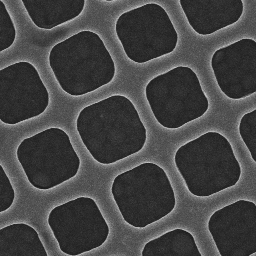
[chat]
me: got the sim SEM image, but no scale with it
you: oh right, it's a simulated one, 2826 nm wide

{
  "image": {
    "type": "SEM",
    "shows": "holes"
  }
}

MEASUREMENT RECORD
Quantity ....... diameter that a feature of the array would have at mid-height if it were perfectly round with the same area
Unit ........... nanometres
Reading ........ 678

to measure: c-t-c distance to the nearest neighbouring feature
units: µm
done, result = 0.784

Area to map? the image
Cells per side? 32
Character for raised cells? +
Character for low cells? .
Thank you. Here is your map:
+++........+++++++.++++.......++
.++.......++++++.....++.......++
.+++.....++++++......++.......++
..+++..+++++++........++....++++
..+++++++...+++.......++++++++++
.++++++......++.......+++++++...
++++++........++.....++++++.....
++++++........+++..+++++++......
+...++........++++++++..+++.....
.....++.......++++++.....++.....
.....++......++++++......++.....
......++...+++++++.......+++....
......+++++++...++........++++++
......+++++......++.......++++++
....++++++.......++......+++++..
++++++++++........++...+++++++..
+++++...++........++++++++.+++..
+++......+........++++++....++..
++.......++.......+++++......++.
++........++....++++++.......++.
+++.......++++++++.+++........++
.++.......++++++.....+........++
.+++....++++++.......++.......++
..+++.++++++++........++....++++
..++++++++++++........+++.++++++
.+++++++....+++.......+++++++...
++++++.......++......++++++.....
++++++.......+++....++++++......
....++........++++++++++++......
.....++......+++++++....++......
.....++......+++++......+++.....
......++...+++++++.......++.....